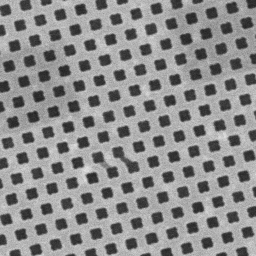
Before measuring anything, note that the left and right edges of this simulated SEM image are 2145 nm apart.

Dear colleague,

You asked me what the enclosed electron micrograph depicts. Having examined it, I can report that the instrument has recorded a regular array of holes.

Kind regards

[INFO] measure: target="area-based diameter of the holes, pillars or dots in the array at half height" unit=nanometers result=106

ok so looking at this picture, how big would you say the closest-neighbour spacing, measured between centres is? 0.175 µm